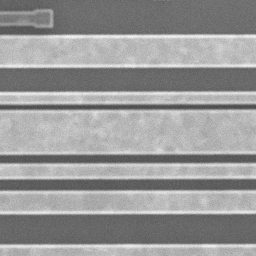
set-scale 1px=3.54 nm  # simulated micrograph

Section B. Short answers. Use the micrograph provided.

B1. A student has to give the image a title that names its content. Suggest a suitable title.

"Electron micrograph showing groups of lines, slits or small figures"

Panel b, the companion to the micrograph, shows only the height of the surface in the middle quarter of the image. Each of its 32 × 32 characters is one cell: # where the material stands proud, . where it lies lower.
#########.......................
................................
................................
................................
................................
................................
................................
################################
################################
################################
................................
................................
################################
################################
################################
################################
################################
################################
################################
################################
################################
################################
................................
................................
................................
################################
################################
################################
................................
................................
................................
................................